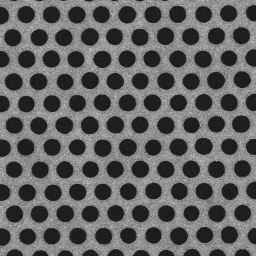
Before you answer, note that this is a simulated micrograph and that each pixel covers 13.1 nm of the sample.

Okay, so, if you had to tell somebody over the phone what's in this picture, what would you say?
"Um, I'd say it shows a regular array of holes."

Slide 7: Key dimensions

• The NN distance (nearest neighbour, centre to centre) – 324 nanometres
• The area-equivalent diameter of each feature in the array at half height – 221 nanometers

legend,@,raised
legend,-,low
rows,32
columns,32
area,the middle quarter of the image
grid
@@--@@@@---@@@@--@@@@--@@@@--@@@
@@@@@@@@@@@@@@@@@@@@@@@@@@@@@@@@
@@@@@---@@@@--@@@@--@@@@---@@@@-
--@@-----@@----@@----@@@---@@@--
--@@-----@@----@@----@@-----@@--
--@@@---@@@----@@----@@@---@@@--
-@@@@@@@@@@@@@@@@@@@@@@@@@@@@@@-
@@@@@@@@@@@@@@@@@@@@@@@@@@@@@@@@
@@---@@@---@@@----@@----@@@---@@
@----@@-----@@----@@----@@-----@
@----@@@----@@----@@----@@@----@
@@---@@@---@@@@--@@@@--@@@@@--@@
@@@@@@@@@@@@@@@@@@@@@@@@@@@@@@@@
-@@@@---@@@@--@@@@--@@@@---@@@@-
--@@----@@@----@@----@@@----@@--
--@@-----@@----@@----@@-----@@--
--@@@---@@@----@@----@@@---@@@--
@@@@@@-@@@@@@@@@@@@@@@@@@-@@@@@@
@@@@@@@@@@@@@@@@@@@@@@@@@@@@@@@@
@@---@@@---@@@----@@@---@@@---@@
@----@@@----@@----@@----@@-----@
@----@@@----@@----@@----@@-----@
@@--@@@@---@@@@--@@@@---@@@---@@
@@@@@@@@@@@@@@@@@@@@@@@@@@@@@@@@
-@@@@@-@@@@@--@@@@--@@@@--@@@@@-
--@@@----@@----@@----@@----@@@--
--@@@----@@----@@----@@-----@@--
--@@@---@@@----@@----@@@---@@@--
-@@@@@@@@@@@@@@@@@@@@@@@@-@@@@@-
@@@@@@@@@@@@@@@@@@@@@@@@@@@@@@@@
@@---@@@---@@@@---@@@---@@@---@@
@-----@@----@@----@@----@@@----@